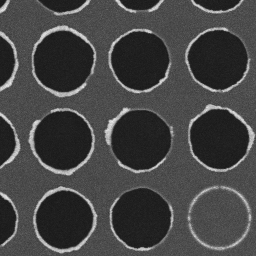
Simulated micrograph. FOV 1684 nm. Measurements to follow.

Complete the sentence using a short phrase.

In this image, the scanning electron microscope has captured a regular array of holes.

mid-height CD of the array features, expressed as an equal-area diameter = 390 nm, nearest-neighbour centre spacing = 511 nanometers